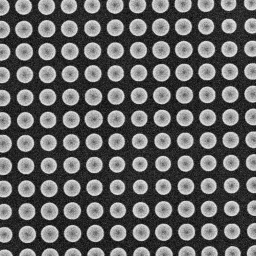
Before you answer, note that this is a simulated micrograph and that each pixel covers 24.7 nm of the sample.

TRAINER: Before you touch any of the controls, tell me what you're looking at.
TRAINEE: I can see an array of small figures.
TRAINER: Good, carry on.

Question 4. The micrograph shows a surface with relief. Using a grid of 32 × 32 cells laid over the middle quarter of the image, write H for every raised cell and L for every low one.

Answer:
LLLLLLLHLLLLLLLLLLHHLLLHHHLLLHHL
HHHLLHHHHLLHHHHLLHHHLLHHHHLLHHHH
HHHLLHHHHLLHHHHLLHHHHLHHHHLLHHHH
HHHLLLHHHLLHHHLLLHHHLLLHHHLLLHHH
LLLLLLLLLLLLLLLLLLLLLLLLLLLLLLLL
LLLLLLLLLLLLLLLLLLLLLLLLLLLLLLLL
LHHLLLHHLLLLHHLLLHHHLLLHHHLLHHHH
HHHHLHHHHLLHHHHLLHHHHLHHHHLLHHHH
HHHHLHHHHLLHHHHLLHHHHLHHHHLLHHHH
HHHLLLHHHLLLHHLLLLHHLLLHHHLLLHHL
LLLLLLLLLLLLLLLLLLLLLLLLLLLLLLLL
LLLLLLLLLLLLLLLLLLLLLLLLLLLLLLLL
HHHLLLHHHLLHHHHLLHHHLLLHHHLLHHHH
HHHHLHHHHLLHHHHLLHHHHLLHHHHLHHHH
HHHHLHHHHLLHHHHLLHHHHLLHHHLLHHHH
LHHLLLHHHLLLHHLLLLLLLLLLHLLLLLLL
LLLLLLLLLLLLLLLLLLLLLLLLLLLLLLLL
LLLLLLLLLLLLLHLLLLHLLLLLHLLLLHHL
HHHLLLHHHLLHHHHLLHHHHLLHHHLLHHHH
HHHHLLHHHLLHHHHLLHHHHLLHHHHLHHHH
HHHHLLHHHLLLHHHLLHHHLLLHHHLLLHHH
LLLLLLLLLLLLLLLLLLLLLLLLLLLLLLLL
LLLLLLLLLLLLLLLLLLLLLLLLLLLLLLLL
LHHLLLLHHLLLHHLLLLHHLLLLHHLLLHHH
HHHHLLHHHLLHHHHLLHHHHLLHHHHLLHHH
HHHHLLHHHHLHHHHLLHHHHLLHHHHLLHHH
HHHHLLHHHLLLHHHLLLHHLLLLHHLLLHHL
LLLLLLLLLLLLLLLLLLLLLLLLLLLLLLLL
LLLLLLLLLLLLLLLLLLLLLLLLLLLLLLLL
LHHLLLHHHLLLHHHLLLHHLLLHHHLLLHHH
HHHHLLHHHLLLHHHLLHHHHLLHHHHLLHHH
HHHHLLHHHLLLHHHLLLHHHLLHHHHLLHHH